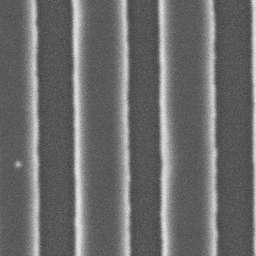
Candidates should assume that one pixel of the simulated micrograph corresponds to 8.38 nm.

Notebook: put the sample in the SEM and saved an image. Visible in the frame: lines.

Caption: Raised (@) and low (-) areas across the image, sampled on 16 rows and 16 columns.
@@---@@@--@@@---
@@---@@@--@@@---
@@---@@@--@@@---
@@---@@@--@@@---
@@---@@@--@@@---
@@---@@@--@@@---
@@---@@@--@@@---
@@---@@@--@@@---
@@---@@@--@@@---
@@---@@@--@@@---
@@---@@@--@@@---
@@---@@@--@@@---
@@---@@@--@@@---
@@---@@@--@@@---
@@---@@@--@@@---
@@---@@@--@@@---